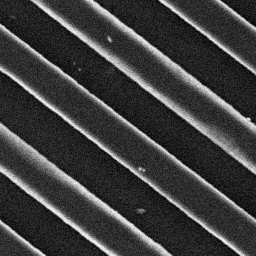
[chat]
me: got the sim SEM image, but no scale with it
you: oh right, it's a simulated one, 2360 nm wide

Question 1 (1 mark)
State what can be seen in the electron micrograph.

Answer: lines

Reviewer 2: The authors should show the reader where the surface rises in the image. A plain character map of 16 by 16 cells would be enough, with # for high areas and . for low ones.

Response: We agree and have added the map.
...###.....###..
....####....####
#....####....###
###....###....##
####....###.....
..###....####...
...####...####..
....####....###.
#....####....###
##.....###....##
###.....####....
.####....####...
..####.....###..
....###.....####
#....####....###
##....####....##